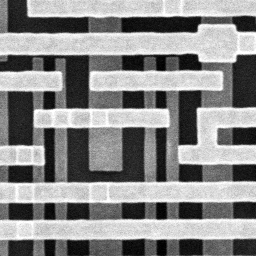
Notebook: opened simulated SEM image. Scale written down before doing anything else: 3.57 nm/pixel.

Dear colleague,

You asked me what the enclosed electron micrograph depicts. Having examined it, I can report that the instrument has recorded wiring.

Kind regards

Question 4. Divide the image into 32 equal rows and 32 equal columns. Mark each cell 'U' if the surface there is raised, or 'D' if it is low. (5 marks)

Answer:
DDDUUUUUUUUUUUUUUUUUUUUUUUUUUUUU
DDDUUUUUUUUUUUUUUUUUUUUUUUUUUUUU
DDDDDDDDDDDDDDDDDDDDDDDDDDDDDDDD
DDDDDDDDDDDDDDDDDDDDDDDDDUUUUDDD
UUUUUUUUUUUUUUUUUUUUUUUUUUUUUUUU
UUUUUUUUUUUUUUUUUUUUUUUUUUUUUUUU
UUUUUUUUUUUUUUUUUUUUUUUUUUUUUUUU
DDDDDDDDDDDDDDDDDDDDDDDDDUUUUDDD
DDDDDDDDDDDDDDDDDDDDDDDDDDDDDDDD
UUUUUUUUDDDUUUUUUUUUUUUUUUUUDDDD
UUUUUUUUDDDUUUUUUUUUUUUUUUUUDDDD
DDDDDDDDDDDDDDDDDDDDDDDDDDDDDDDD
DDDDDDDDDDDDDDDDDDDDDDDDDDDDDDDD
DDDDDDDDDDDDDDDDDDDDDDDDDDDUUUDU
DDDDUUUUUUUUUUUUUUUUUDDDDUUUUUUU
DDDDUUUUUUUUUUUUUUUUUDDDDUUUUUUU
DDDDDDDDDDDDDDDDDDDDDDDDDUUDDDDD
DDDDDDDDDDDDDDDDDDDDDDDDDUUDDDDD
UUUUUDDDDDDDDDDDDDDDDDUUUUUUUUUU
UUUUUDDDDDDDDDDDDDDDDDUUUUUUUUUU
UUUUUDDDDDDDDDDDDDDDDDDDDDDDDDDD
DDDDDDDDDDDDDDDDDDDDDDDDDDDDDDDD
DDDDDDDDDDDDDDDDDDDDDDDDDDDDDDDD
UUUUUUUUUUUUUUUUUUUUUUUUUUUUUUUU
UUUUUUUUUUUUUUUUUUUUUUUUUUUUUUUU
DDDDDDDDDDDDDDDDDDDDDDDDDDDDDDDD
DDDDDDDDDDDDDDDDDDDDDDDDDDDDDDDD
DDDDDDDDDDUDDDDUUUUUUUUUUUUUUUUU
UUUUUUUUUUUUUUUUUUUUUUUUUUUUUUUU
UUUUUUUUUUUUUUUUUUUUUUUUUUUUUUUU
DDDDDDDDDDDDDDDDDDDDDDDDDDDDDDDD
DDDDDDDDDDDDDDDDDDDDDDDDDDDDDDDD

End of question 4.